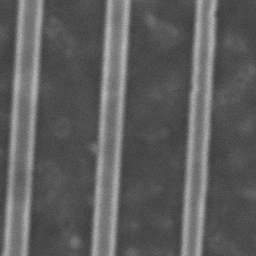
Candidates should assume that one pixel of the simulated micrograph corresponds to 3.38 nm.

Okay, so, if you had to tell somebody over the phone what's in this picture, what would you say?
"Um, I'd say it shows one or a few lines or trenches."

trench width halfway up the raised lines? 237 nanometers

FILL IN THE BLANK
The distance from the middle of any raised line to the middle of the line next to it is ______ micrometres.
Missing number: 0.297